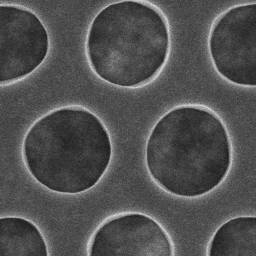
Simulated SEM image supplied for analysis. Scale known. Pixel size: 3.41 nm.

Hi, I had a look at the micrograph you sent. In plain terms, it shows holes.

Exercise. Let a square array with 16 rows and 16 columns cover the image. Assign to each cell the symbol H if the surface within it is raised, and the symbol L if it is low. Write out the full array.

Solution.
LHHHHHHLLHHHHHHL
LLLHHHLLLLHHHLLL
LLLHHHLLLLHHHLLL
LLLHHHLLLLHHHLLL
LLHHHHLLLLHHHHLL
HHHHHHHHHHHHHHHH
HHHHHHHHHHHHHHHH
HHHLLLHHHHLLLLHH
HHLLLLLHHLLLLLHH
HLLLLLLHHLLLLLHH
HHLLLLLHHLLLLLHH
HHHLLLHHHHLLLLHH
HHHHHHHHHHHHHHHH
HHHHHHHHLHHHHHHH
LLHHHHLLLLHHHHLL
LLLHHHLLLLLHHLLL